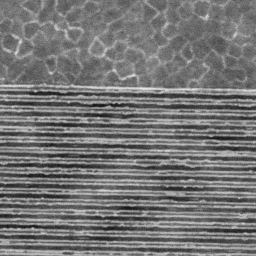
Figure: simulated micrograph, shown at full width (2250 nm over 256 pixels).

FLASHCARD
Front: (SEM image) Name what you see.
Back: parallel lines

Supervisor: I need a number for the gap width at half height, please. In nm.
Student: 48.3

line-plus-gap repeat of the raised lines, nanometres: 90.2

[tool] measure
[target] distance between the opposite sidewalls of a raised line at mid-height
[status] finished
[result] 40.6 nanometres